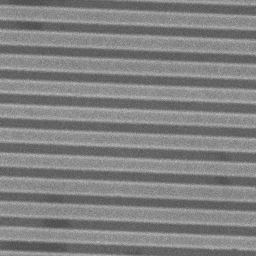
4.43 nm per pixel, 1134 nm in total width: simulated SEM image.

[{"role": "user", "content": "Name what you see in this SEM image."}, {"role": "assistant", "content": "parallel lines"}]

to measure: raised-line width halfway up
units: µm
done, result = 0.0608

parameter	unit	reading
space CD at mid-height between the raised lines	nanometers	49.7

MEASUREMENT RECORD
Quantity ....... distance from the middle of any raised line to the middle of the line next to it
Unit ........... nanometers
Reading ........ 108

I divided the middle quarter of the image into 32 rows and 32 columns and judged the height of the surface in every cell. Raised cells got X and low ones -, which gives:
XXXXXXXXXXXXXXXXXXXXXXXXXXXXXXXX
XXXXXXXXXXXXXXXXXXXXXXXXXXXXXXXX
----------------XXXXXXXXXXXXXXXX
--------------------------------
--------------------------------
XXXXXXXXXXXXXXXXXXXXX-----------
XXXXXXXXXXXXXXXXXXXXXXXXXXXXXXXX
XXXXXXXXXXXXXXXXXXXXXXXXXXXXXXXX
---------------------XXXXXXXXXXX
--------------------------------
--------------------------------
XXXXXXXXXXXXXXX-----------------
XXXXXXXXXXXXXXXXXXXXXXXXXXXXXXXX
XXXXXXXXXXXXXXXXXXXXXXXXXXXXXXXX
--------------XXXXXXXXXXXXXXXXXX
--------------------------------
--------------------------------
XXXXXXXXXXXXXXXXXXX-------------
XXXXXXXXXXXXXXXXXXXXXXXXXXXXXXXX
XXXXXXXXXXXXXXXXXXXXXXXXXXXXXXXX
-------------XXXXXXXXXXXXXXXXXXX
--------------------------------
--------------------------------
XXXXXXXXXXXXX-------------------
XXXXXXXXXXXXXXXXXXXXXXXXXXXXXXXX
XXXXXXXXXXXXXXXXXXXXXXXXXXXXXXXX
------------XXXXXXXXXXXXXXXXXXXX
--------------------------------
--------------------------------
XXXXXXXXXXXX--------------------
XXXXXXXXXXXXXXXXXXXXXXXXXXXXXXXX
XXXXXXXXXXXXXXXXXXXXXXXXXXXXXXXX